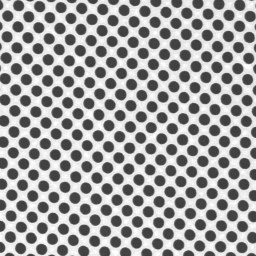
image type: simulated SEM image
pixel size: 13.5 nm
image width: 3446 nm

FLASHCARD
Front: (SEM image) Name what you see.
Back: a regular array of holes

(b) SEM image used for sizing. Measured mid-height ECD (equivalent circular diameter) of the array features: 154 nm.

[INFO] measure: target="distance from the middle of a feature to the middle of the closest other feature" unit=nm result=197